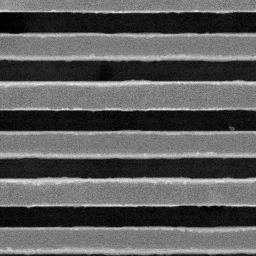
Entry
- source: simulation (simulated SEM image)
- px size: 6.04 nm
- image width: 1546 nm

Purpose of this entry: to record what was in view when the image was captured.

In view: lines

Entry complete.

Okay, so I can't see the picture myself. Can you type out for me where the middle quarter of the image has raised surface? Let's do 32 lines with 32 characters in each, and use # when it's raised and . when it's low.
................................
................................
................................
................................
######....######################
################################
################################
################################
################################
################################
################################
.......#.......#................
................................
................................
................................
................................
................................
################################
################################
################################
################################
################################
################################
.###..######......###...........
................................
................................
................................
................................
................................
################################
################################
################################